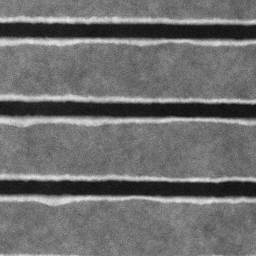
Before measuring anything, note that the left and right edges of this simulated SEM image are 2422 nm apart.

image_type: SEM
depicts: lines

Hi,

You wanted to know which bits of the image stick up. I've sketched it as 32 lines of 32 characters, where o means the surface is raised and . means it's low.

oooooooooooooooooooooooooooooooo
oooooooooooooooooooooooooooooooo
oooooooooooooooooooooooooooooooo
................................
................................
oooooooooooooooooooooooooooooooo
oooooooooooooooooooooooooooooooo
oooooooooooooooooooooooooooooooo
oooooooooooooooooooooooooooooooo
oooooooooooooooooooooooooooooooo
oooooooooooooooooooooooooooooooo
oooooooooooooooooooooooooooooooo
..oooooooooooooooooooooooooooooo
................................
................................
oooooooooooooooooooooooooooooooo
oooooooooooooooooooooooooooooooo
oooooooooooooooooooooooooooooooo
oooooooooooooooooooooooooooooooo
oooooooooooooooooooooooooooooooo
oooooooooooooooooooooooooooooooo
oooooooooooooooooooooooooooooooo
..oooooooooooooooooooooooooooooo
................................
..ooo...........................
oooooooooooooooooooooooooooooooo
oooooooooooooooooooooooooooooooo
oooooooooooooooooooooooooooooooo
oooooooooooooooooooooooooooooooo
oooooooooooooooooooooooooooooooo
oooooooooooooooooooooooooooooooo
oooooooooooooooooooooooooooooooo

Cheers